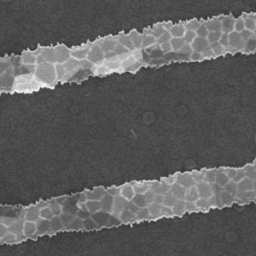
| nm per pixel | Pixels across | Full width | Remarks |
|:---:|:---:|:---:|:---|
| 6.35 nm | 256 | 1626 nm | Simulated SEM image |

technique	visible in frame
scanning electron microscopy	one or a few lines or trenches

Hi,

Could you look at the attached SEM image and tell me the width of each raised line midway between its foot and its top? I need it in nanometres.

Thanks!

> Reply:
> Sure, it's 240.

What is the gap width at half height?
0.703 microns